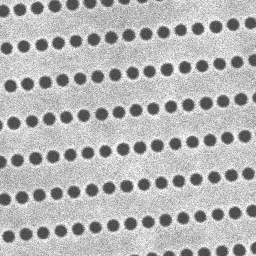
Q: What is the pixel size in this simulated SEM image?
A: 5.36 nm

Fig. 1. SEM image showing a regular array of holes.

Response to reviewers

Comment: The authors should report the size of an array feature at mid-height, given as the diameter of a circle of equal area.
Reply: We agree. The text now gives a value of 13.2 px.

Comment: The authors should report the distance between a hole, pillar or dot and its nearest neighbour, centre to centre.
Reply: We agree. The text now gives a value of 0.0929 µm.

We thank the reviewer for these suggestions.